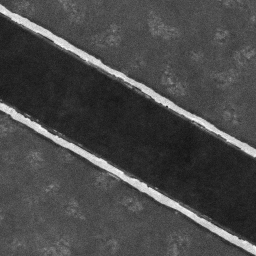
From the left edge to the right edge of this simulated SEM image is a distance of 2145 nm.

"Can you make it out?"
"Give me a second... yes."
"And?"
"one or a few lines or trenches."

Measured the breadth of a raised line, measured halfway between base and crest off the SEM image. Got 731 nanometers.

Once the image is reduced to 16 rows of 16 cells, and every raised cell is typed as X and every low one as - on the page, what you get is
----------------
XX--------------
XXXX------------
XXXXX-----------
XXXXXXX---------
XXXXXXXXX-------
XXXXXXXXXXX-----
-XXXXXXXXXXXX---
---XXXXXXXXXXX--
-----XXXXXXXXXXX
-------XXXXXXXXX
--------XXXXXXXX
----------XXXXXX
------------XXXX
--------------XX
----------------